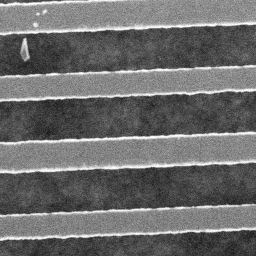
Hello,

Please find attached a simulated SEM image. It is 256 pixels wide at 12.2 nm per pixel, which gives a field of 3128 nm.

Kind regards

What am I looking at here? lines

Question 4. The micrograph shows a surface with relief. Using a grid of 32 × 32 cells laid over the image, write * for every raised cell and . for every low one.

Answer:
....****************************
********************************
********************************
*******************.............
................................
................................
................................
................................
...........................*****
...*****************************
********************************
***************************.....
***.............................
................................
................................
................................
................................
...........*********************
********************************
********************************
**************************......
***.............................
................................
................................
................................
................................
............********************
********************************
********************************
************....................
................................
................................